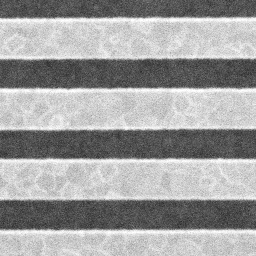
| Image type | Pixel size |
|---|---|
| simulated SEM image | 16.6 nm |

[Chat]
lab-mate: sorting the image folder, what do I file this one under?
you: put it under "lines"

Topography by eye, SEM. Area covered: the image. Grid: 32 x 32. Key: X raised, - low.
--------------------------------
--------------------------------
XXXXXXXXXXXXXXXXXXXXXXXXXXXXXXXX
XXXXXXXXXXXXXXXXXXXXXXXXXXXXXXXX
XXXXXXXXXXXXXXXXXXXXXXXXXXXXXXXX
XXXXXXXXXXXXXXXXXXXXXXXXXXXXXXXX
XXXXXXXXXXXXXXXXXXXXXXXXXXXXXXXX
--------------------------------
--------------------------------
--------------------------------
--------------------------------
XXXXXXXXXXXXXXXXXXXXXXXXXXXXXXXX
XXXXXXXXXXXXXXXXXXXXXXXXXXXXXXXX
XXXXXXXXXXXXXXXXXXXXXXXXXXXXXXXX
XXXXXXXXXXXXXXXXXXXXXXXXXXXXXXXX
XXXXXXXXXXXXXXXXXXXXXXXXXXXXXXXX
--------------------------------
--------------------------------
--------------------------------
--------------------------------
XXXXXXXXXXXXXXXXXXXXXXXXXXXXXXXX
XXXXXXXXXXXXXXXXXXXXXXXXXXXXXXXX
XXXXXXXXXXXXXXXXXXXXXXXXXXXXXXXX
XXXXXXXXXXXXXXXXXXXXXXXXXXXXXXXX
XXXXXXXXXXXXXXXXXXXXXXXXXXXXXXXX
--------------------------------
--------------------------------
--------------------------------
--------------------------------
XXXXXXXXXXXXXXXXXXXXXXXXXXXXXXXX
XXXXXXXXXXXXXXXXXXXXXXXXXXXXXXXX
XXXXXXXXXXXXXXXXXXXXXXXXXXXXXXXX